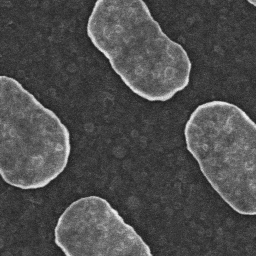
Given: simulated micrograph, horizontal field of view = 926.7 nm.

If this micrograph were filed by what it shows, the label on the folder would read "raised bodies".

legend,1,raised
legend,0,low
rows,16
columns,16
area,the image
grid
0000001110000000
0000001111000000
0000001111100000
0000000111110000
0000000111110000
1000000011100000
1110000000000100
1111000000001111
1111000000001111
1111000000001111
1111000000000111
0110000000000111
0000010000000011
0000111000000000
0000111100000000
0000111110000000